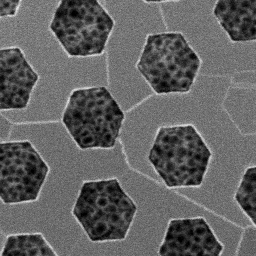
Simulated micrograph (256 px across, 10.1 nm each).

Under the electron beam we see holes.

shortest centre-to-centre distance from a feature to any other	0.935	microns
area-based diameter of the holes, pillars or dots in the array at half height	563	nm